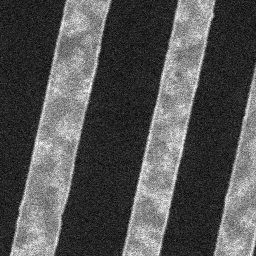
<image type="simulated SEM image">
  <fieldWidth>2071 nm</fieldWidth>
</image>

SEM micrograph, one or a few lines or trenches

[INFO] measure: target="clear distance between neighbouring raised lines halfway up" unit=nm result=550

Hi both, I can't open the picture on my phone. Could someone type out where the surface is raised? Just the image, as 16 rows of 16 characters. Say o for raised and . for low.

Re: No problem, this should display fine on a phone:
....ooo....oo...
....oo.....oo...
....oo.....oo...
...ooo....ooo...
...ooo....oo....
...ooo....oo....
...oo.....oo....
...oo.....oo...o
..ooo....ooo...o
..ooo....oo....o
..ooo....oo....o
..oo.....oo...oo
.ooo....ooo...oo
.ooo....oo....oo
.ooo....oo....oo
.oo.....oo....oo